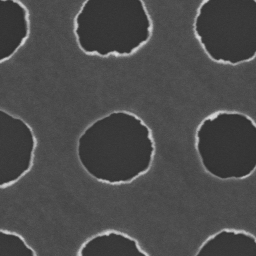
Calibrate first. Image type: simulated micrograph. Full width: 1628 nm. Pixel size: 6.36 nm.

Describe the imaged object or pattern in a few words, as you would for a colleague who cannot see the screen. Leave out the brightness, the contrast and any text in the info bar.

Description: holes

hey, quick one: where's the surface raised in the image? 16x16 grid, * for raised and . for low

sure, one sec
.****....****...
..***....***....
.****....****...
*************...
****************
****************
****************
.*****...****..*
..***....***....
..***....***....
..***....****...
****************
****************
****************
****************
..***....****...